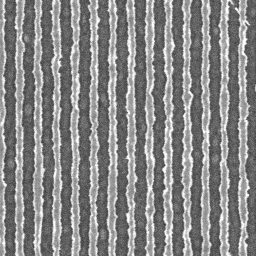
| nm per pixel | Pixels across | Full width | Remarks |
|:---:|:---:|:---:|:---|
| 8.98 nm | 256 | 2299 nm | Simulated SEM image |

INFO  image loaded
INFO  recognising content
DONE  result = parallel lines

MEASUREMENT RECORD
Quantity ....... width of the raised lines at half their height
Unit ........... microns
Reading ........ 0.0651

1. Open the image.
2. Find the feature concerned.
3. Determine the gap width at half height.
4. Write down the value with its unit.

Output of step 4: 106 nm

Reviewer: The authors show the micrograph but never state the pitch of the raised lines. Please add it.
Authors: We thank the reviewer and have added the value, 0.167 microns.